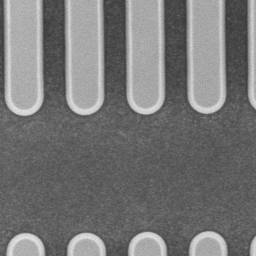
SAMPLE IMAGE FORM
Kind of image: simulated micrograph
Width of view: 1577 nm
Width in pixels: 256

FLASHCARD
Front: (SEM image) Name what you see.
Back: groups of lines, slits or small figures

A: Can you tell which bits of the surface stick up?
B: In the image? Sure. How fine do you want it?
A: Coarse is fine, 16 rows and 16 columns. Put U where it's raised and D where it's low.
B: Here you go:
UUDDUUDDUUDDUUDD
UUDDUUDDUUDDUUDD
UUDDUUDDUUDDUUDD
UUDDUUDDUUDDUUDD
UUUDUUDDUUDDUUDD
UUUDUUDDUUDDUUDD
DUDDUUDDUUDDUUDD
DDDDDDDDDDDDDDDD
DDDDDDDDDDDDDDDD
DDDDDDDDDDDDDDDD
DDDDDDDDDDDDDDDD
DDDDDDDDDDDDDDDD
DDDDDDDDDDDDDDDD
DDDDDDDDDDDDDDDD
DDDDDDDDDDDDDDDD
DUUDUUDDUUDDUUDD